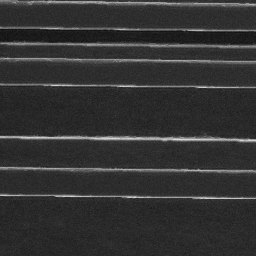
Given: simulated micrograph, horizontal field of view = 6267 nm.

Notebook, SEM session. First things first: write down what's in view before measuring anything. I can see lines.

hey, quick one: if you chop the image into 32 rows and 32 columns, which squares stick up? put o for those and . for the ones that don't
oooooooooooooooooooooooooooooooo
oooooooooooooooooooooooooooooooo
oooooooooooooooooooooooooooooooo
......oooooooooooooooooooooooooo
................................
ooo.............................
oooooooooooooooooooooooooooooooo
oooooooooooooooooooooooooooooooo
oooooooooooooooooooooooooooooooo
oooooooooooooooooooooooooooooooo
oooooooooooooooooooooooooooooooo
................................
................................
................................
................................
................................
................................
ooooooooooooooooooooooo.........
oooooooooooooooooooooooooooooooo
oooooooooooooooooooooooooooooooo
oooooooooooooooooooooooooooooooo
oooooooooooooooooooooooooooooooo
oooooooooooooooooooooooooooooooo
oooooooooooooooooooooooooooooooo
.........ooooooooooooooooooooooo
................................
................................
................................
................................
................................
................................
................................